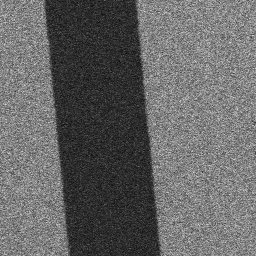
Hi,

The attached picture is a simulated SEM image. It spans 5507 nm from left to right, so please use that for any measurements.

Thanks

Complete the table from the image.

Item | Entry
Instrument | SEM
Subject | one or a few lines or trenches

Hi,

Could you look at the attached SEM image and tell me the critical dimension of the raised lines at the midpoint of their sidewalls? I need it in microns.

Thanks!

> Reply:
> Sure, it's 1.99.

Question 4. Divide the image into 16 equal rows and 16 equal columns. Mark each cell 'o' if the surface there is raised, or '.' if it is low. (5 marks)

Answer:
...oooooo.......
...oooooo.......
...oooooo.......
...oooooo.......
...oooooo.......
...oooooo.......
...oooooo.......
...oooooo.......
....ooooo.......
....ooooo.......
....oooooo......
....oooooo......
....oooooo......
....oooooo......
....oooooo......
....oooooo......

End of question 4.